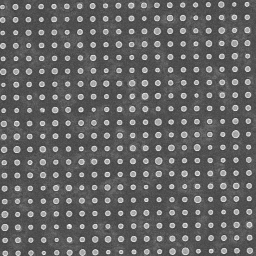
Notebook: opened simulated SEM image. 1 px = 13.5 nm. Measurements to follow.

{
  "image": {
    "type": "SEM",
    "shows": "a regular array of raised bodies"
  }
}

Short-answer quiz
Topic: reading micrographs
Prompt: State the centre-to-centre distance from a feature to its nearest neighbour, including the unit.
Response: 171 nanometres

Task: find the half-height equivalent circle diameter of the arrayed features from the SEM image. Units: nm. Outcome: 69.6